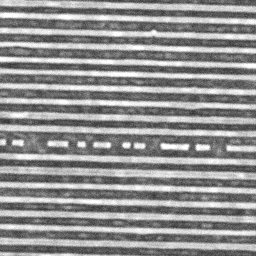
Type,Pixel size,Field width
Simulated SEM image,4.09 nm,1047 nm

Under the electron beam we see parallel lines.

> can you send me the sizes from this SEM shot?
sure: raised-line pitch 0.0573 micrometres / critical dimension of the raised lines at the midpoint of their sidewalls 19.4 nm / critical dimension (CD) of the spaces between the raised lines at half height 38.3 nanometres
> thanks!